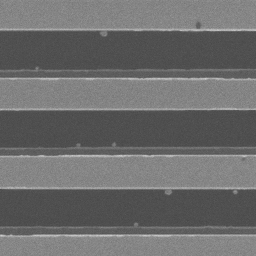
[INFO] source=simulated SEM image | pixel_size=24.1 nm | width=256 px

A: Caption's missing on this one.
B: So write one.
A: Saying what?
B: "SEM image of lines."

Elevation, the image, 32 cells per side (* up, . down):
********************************
********************************
********************************
********************************
................................
................................
................................
................................
................................
********************************
********************************
********************************
********************************
********************************
................................
................................
................................
................................
.........................****.**
********************************
********************************
********************************
********************************
********************************
................................
................................
................................
................................
******.**.********.*..**.*****..
********************************
********************************
********************************